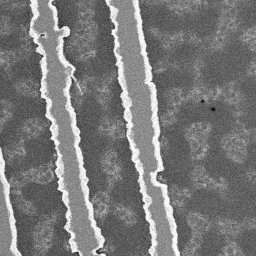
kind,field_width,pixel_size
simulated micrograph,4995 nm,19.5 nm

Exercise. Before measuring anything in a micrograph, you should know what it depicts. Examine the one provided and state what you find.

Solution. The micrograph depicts one or a few lines or trenches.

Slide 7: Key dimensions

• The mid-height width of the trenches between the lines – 54.7 px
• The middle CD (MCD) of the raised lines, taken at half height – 468 nm